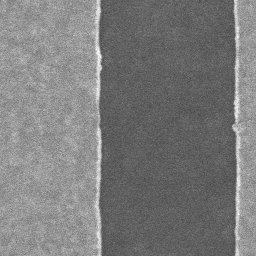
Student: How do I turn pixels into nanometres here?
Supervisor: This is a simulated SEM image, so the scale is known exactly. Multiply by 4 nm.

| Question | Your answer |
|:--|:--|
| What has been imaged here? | one or a few lines or trenches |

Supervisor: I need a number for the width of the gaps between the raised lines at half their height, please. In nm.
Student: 544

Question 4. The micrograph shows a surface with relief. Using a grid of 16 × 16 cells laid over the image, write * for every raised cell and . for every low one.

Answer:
******.........*
******.........*
******.........*
******.........*
******.........*
******.........*
******.........*
******.........*
******.........*
******.........*
******.........*
******.........*
******.........*
******.........*
******.........*
******.........*